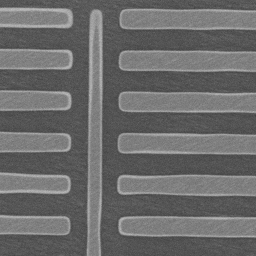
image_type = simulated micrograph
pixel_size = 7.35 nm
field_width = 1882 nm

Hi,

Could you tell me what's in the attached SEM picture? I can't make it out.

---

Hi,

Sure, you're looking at groups of lines, slits or small figures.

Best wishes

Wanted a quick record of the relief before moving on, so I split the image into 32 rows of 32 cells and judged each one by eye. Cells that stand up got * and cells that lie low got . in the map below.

................................
********.......*****************
*********..**..*****************
...........**..*****************
...........**...................
...........**...................
*********..**..*************.***
*********..**..*****************
********...**..*****************
...........**...................
...........**...................
******.....**...................
*********..**..*****************
********...**..*****************
...........**...................
...........**...................
...........**...................
*********..**..*****************
*********..**..*****************
...........**...................
...........**...................
...........**...................
*********..**..*****************
*********..**..*****************
...........**...................
...........**...................
...........**...................
*********..**..*****************
*********..*...*****************
...........*..............******
...........**...................
...........**...................